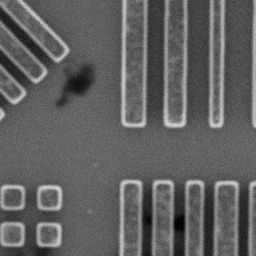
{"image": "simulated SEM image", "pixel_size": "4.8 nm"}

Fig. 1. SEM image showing groups of lines, slits or small figures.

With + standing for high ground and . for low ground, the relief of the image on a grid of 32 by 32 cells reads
+++.............++...++...++....
.+++............++...++...++....
..+++...........++...++...++....
+..+++..........++...++...++....
++..+++.........++...++...++....
+++..+++.......+++...++...++....
.+++..++.......+++...++...++....
..+++..........+++...++...++....
...++..........+++...++...++....
+...+..........+++...++...++....
++.............+++...++...++....
+++............+++...++...++....
.+.............+++...++...++....
...............+++...++...++....
...............+++...++...++....
................++...++.........
................................
................................
................................
................................
................................
................................
................................
.+.............+++.++..++..+++.+
+++..++........+++.++..++..+++.+
+++..++........+++.++..++..+++.+
...............+++.++..++..+++.+
...............+++.++..++..+++.+
+++..++........+++.++..++..++..+
+++..++........+++.++..++..++..+
.+...++........+++.++..++..++..+
...............++..++..++..++..+